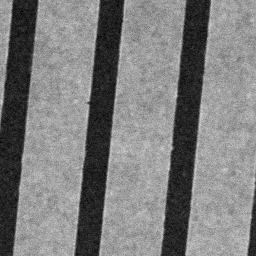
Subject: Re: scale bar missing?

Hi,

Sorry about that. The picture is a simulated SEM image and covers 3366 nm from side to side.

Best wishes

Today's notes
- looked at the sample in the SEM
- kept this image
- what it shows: one or a few lines or trenches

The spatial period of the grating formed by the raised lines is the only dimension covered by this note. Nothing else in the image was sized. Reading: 1.13 µm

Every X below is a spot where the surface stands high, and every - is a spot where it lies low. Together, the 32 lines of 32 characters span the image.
XXXX-XXXXXXX----XXXXXXX---XXXXXX
X--XXXXXXXXX----XXXXXXX---XXXXXX
X---XXXXXXXX---XXXXXXXX---XXXXXX
X----XXXXXXX---XXXXXXXX---XXXXXX
X---XXXXXXXX---XXXXXXXX---XXXXXX
X---XXXXXXXX---XXXXXXXX---XXXXXX
X--XXXXXXXXX---XXXXXXXX--XXXXXXX
X--XXXXXXXXX---XXXXXXX----XXXXXX
X--XXXXXXXXX---XXXXXXX----XXXXXX
X---XXXXXXX----XXXXXXX---XXXXXXX
----XXXXXXX----XXXXXXX---XXXXXXX
----XXXXXXX----XXXXXXX--XXXXXXXX
----XXXXXXX---XXXXXXXX---XXXXXXX
----XXXXXXX---XXXXXXXX---XXXXXXX
---XXXXXXXX---XXXXXXXX---XXXXXXX
---XXXXXXXX---XXXXXXXX---XXXXXXX
X--XXXXXXXX---XXXXXXXX---XXXXXXX
--XXXXXXXXX---XXXXXXX----XXXXXXX
---XXXXXXXX---XXXXXXX----XXXXXXX
---XXXXXXX----XXXXXXX---XXXXXXXX
---XXXXXXX----XXXXXXX---XXXXXXXX
-X-XXXXXXX----XXXXXXX---XXXXXXXX
---XXXXXXX---XXXXXXXX---XXXXXXXX
---XXXXXXX---XXXXXXXX---XXXXXXXX
--XXXXXXXX---XXXXXXXX---XXXXXXXX
--XXXXXXXX---XXXXXXXX---XXXXXXXX
--XXXXXXXX---XXXXXXXXXX-XXXXXXX-
--XXXXXXXX---XXXXXXX--X-XXXXXXX-
--XXXXXXXX---XXXXXXXXX--XXXXXXX-
--XXXXXXX----XXXXXXX----XXXXXXX-
--XXXXXXX----XXXXXXX---XXXXXXXX-
--XXXXXXX----XXXXXXX---XXXXXXXX-